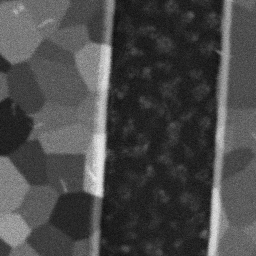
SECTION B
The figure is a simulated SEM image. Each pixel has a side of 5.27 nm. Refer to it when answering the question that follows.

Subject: one or a few lines or trenches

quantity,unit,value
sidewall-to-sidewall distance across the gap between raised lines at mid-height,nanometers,628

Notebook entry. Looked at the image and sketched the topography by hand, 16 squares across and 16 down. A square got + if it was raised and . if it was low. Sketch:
+++++++.......++
+++++++.......++
+++++++.......++
+++++++.......++
+++++++.......++
++++++........++
++++++........++
++++++........++
++++++........++
++++++........++
++++++........++
++++++........++
++++++........++
++++++.......+++
++++++.......+++
++++++.......+++